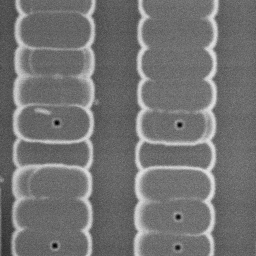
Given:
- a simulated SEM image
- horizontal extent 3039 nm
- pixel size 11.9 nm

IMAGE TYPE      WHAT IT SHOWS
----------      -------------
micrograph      wiring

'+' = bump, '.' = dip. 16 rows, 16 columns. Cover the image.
.+++++...++++...
.+++++...++++...
.+++++...++++...
.+++++...++++...
.+++++...++++...
.+++++...++++...
.+++++...++++...
.+++++...++++...
.+++++...++++...
.+++++...++++...
.++++....++++...
.+++++...++++...
.++++....++++...
.+++++...++++...
.+++++...++++...
.+++++...++++...